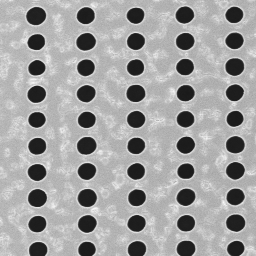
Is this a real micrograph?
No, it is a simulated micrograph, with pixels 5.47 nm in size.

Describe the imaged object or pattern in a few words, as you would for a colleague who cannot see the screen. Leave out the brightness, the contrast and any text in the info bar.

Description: a regular array of holes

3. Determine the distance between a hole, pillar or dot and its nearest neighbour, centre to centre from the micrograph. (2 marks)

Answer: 141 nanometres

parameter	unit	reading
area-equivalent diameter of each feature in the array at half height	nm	94.1